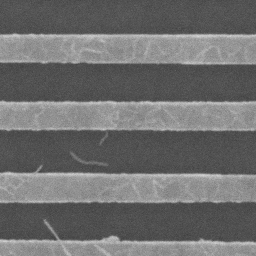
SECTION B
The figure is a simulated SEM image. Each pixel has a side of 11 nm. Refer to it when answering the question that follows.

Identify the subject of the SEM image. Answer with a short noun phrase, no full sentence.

lines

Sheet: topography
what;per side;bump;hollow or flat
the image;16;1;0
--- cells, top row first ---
0000000000000000
0000000000000000
1111111111111111
1111111111111111
0000000000000000
0000000000000000
1111111111111111
1111111111111111
0000000000000000
0000000000000000
0000000000000000
1111111111111111
1111111111111111
0000000000000000
0000000000000000
1111111111111111